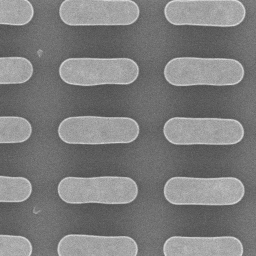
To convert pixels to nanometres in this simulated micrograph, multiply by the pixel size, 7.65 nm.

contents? groups of lines, slits or small figures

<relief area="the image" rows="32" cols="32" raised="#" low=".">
####....#########....#########..
####....#########....##########.
####....#########....#########..
................................
................................
................................
................................
###.....########......#######...
####....#########....#########..
####....#########....#########..
.........####.........#######...
................................
................................
................................
................................
####....#########....#########..
####...##########...##########..
###.....#########....#########..
................................
................................
................................
................................
###.....#########....#########..
####...##########....#########..
####....#########....#########..
.........................####...
................................
................................
................................
#.......###.....................
####...##########....#########..
####...##########...##########..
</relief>